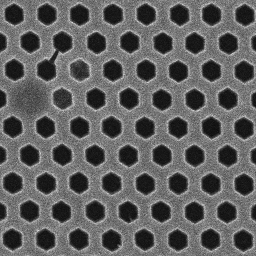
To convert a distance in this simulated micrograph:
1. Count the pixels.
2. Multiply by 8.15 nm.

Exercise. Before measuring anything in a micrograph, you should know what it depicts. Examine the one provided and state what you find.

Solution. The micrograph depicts a regular array of holes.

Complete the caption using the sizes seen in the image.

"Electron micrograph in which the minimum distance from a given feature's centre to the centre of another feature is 262 nm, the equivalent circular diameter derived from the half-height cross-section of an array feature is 19.2 pixels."